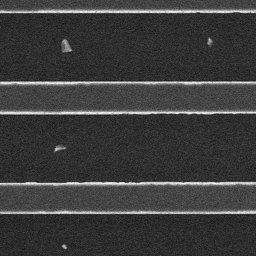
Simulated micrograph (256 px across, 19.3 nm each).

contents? lines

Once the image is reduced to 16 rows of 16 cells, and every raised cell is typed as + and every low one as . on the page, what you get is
++++++++++++++++
................
................
................
................
++++++++++++++++
++++++++++++++++
................
................
................
................
++++++++++++++++
++++++++++++++++
................
................
................